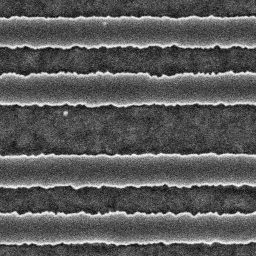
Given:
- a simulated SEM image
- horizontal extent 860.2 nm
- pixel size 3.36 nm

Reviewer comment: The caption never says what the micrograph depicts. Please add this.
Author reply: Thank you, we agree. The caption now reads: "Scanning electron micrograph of lines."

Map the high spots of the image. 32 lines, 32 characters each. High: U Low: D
DDDDDDDDDDDDDDDDDDDDDDDDDDDDDDDD
DDDDDDDDDDDDDDDDDDDDDDDDDDDDDDDD
UUUUUUUUUUUUUUUUUUUUUUUUUUUUUUUU
UUUUUUUUUUUUUUUUUUUUUUUUUUUUUUUU
UUUUUUUUUUUUUUUUUUUUUUUUUUUUUUUU
UUUUUUUUUUUUUUUUUUUUUUUUUUUUUUUU
DDDDDDDDDDDDDDDDDDDDDDDDDDDDDDDD
DDDDDDDDDDDDDDDDDDDDDDDDDDDDDDDD
DDDDDDDDDDDDDDDDDDDDDDDDDDDDDDDD
UUUUUUUUUUUUUUUUUUUDUDUUUUUUUUUU
UUUUUUUUUUUUUUUUUUUUUUUUUUUUUUUU
UUUUUUUUUUUUUUUUUUUUUUUUUUUUUUUU
UUUUUUUUUUUUUUUUUUUUUUUUUUUUUUUU
DDDDDDDDDDDDDDDDDDDDDDDDDDDDDDDD
DDDDDDDDDDDDDDDDDDDDDDDDDDDDDDDD
DDDDDDDDDDDDDDDDDDDDDDDDDDDDDDDD
DDDDDDDDDDDDDDDDDDDDDDDDDDDDDDDD
DDDDDDDDDDDDDDDDDDDDDDDDDDDDDDDD
DDDDDDDDDDDDDDDDDDDDDDDDDDDDDDDD
DDUDUUUUUUUUUUUUUUUUUUUUUUUUUUUU
UUUUUUUUUUUUUUUUUUUUUUUUUUUUUUUU
UUUUUUUUUUUUUUUUUUUUUUUUUUUUUUUU
UUUUUUUUUUUUUUUUUUUUUUUUUUUUUUUU
DDDDDDDDDUDDDDDDDDDDDDDDDDDDDDDD
DDDDDDDDDDDDDDDDDDDDDDDDDDDDDDDD
DDDDDDDDDDDDDDDDDDDDDDDDDDDDDDDD
DDDDDDDDDDDDDDUDDDDDDDDDDDDDDDDD
UUUUUUUUUUUUUUUUUUUUUUUUUUUUUUUU
UUUUUUUUUUUUUUUUUUUUUUUUUUUUUUUU
UUUUUUUUUUUUUUUUUUUUUUUUUUUUUUUU
UUUDUUUDDDDDDDUUDDDDDDDDDDDDDDDD
DDDDDDDDDDDDDDDDDDDDDDDDDDDDDDDD